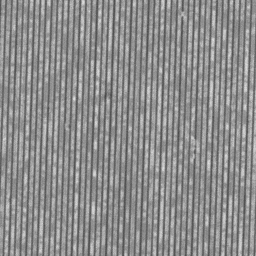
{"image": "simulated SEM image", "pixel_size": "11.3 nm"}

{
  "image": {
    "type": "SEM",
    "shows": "parallel lines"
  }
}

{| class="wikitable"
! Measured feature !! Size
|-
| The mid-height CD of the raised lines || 29.7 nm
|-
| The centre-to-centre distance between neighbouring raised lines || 64.6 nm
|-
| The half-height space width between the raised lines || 29.7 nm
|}